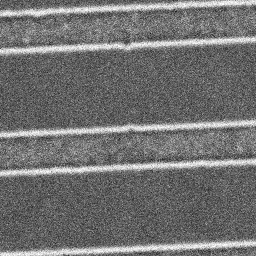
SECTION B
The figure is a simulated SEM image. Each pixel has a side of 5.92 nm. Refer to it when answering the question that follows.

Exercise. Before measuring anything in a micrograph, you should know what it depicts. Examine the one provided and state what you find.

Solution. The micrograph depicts one or a few lines or trenches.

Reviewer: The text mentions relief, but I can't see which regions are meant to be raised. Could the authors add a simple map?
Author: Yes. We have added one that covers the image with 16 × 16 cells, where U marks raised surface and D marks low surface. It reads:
UUUUUUUUDDDDDDDD
DDDDDDDDDDDDDDDD
DDDDDDDDDDDDDDDU
UUUUUUUUUUUUUUUU
UUUUUUUUUUUUUUUU
UUUUUUUUUUUUUUUU
UUUUUUUUUUUUUUUU
UUUUUUUUUUUUUUUU
DDDDDDDDDDDDDDDD
DDDDDDDDDDDDDDDD
DDDDDDDUUUUUUUUU
UUUUUUUUUUUUUUUU
UUUUUUUUUUUUUUUU
UUUUUUUUUUUUUUUU
UUUUUUUUUUUUUUUU
UUUUUUUUUDDDDDDD